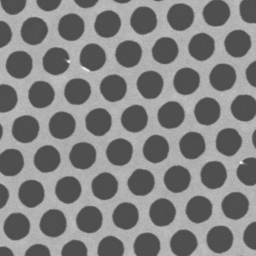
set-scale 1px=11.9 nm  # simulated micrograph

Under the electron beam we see a regular array of holes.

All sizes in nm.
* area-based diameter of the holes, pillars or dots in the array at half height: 324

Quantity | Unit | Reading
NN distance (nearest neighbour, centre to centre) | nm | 433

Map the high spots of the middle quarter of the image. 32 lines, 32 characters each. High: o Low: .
.ooo......ooooo...oooooooooooooo
.ooooo..ooooooooooooooooooooo...
oooooooooooo.oooooo.....oooo....
oooooooooo.....oooo......ooo....
o.....ooo......ooo.......oo.....
.......oo.......oo.......ooo....
.......oo.......oo.......ooo....
.......oo......oooo.....ooooo..o
......oooo.....ooooo...ooooooooo
o....ooooooo.ooooooooooooo..oooo
ooooooooooooooooo..ooooo.....ooo
ooooooo...ooooo.....oooo......oo
..oooo.....oooo......oo.......oo
..ooo.......oo.......oo.......oo
...oo.......oo.......ooo......oo
...oo.......ooo......ooo.....ooo
...ooo.....ooooo....oooooooooooo
..ooooo...oooooooooooooooooooo..
ooooooooooooooooooooo....oooo...
oooooooooooo....oooo......ooo...
oo.....oooo......ooo......ooo...
oo......oo.......ooo......ooo...
o.......ooo......ooo......ooo...
o.......ooo......ooo......oooo..
oo......ooo.....oooooo..oooooooo
oo.....ooooooo.oooooooooooo..ooo
oooooooooooooooooo...ooooo.....o
ooooooooo...ooooo.....ooo.......
...ooooo.....ooo.......oo.......
....ooo......ooo.......oo......o
....ooo......ooo......ooo......o
....ooo......ooo......oooo....oo